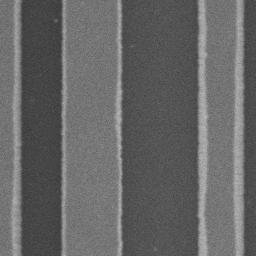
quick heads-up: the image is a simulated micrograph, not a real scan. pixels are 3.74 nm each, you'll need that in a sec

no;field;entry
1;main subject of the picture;lines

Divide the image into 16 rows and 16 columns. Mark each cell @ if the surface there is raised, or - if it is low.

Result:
@---@@@@-----@@-
@---@@@@-----@@-
@---@@@@-----@@-
@---@@@@-----@@-
@---@@@@-----@@-
@---@@@@-----@@-
@---@@@@-----@@-
@---@@@@-----@@-
@---@@@@-----@@-
@---@@@@-----@@-
@---@@@@-----@@-
@---@@@@-----@@-
@---@@@@-----@@-
@---@@@@-----@@-
@---@@@@-----@@-
@---@@@@-----@@-